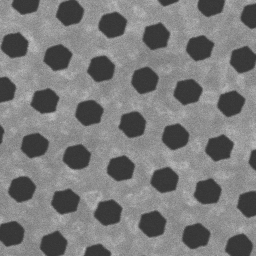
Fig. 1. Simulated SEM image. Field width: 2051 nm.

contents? a regular array of holes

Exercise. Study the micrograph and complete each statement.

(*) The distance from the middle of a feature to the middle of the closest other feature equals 358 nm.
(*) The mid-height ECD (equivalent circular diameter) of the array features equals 210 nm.